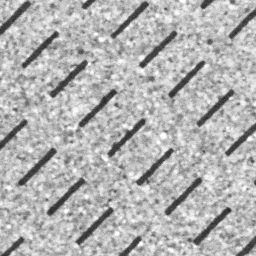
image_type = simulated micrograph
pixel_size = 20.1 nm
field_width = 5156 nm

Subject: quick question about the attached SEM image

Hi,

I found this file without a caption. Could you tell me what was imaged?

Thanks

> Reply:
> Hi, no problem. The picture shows a regular array of holes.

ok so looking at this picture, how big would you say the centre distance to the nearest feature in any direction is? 0.827 micrometres